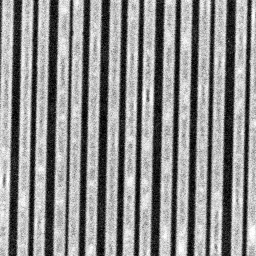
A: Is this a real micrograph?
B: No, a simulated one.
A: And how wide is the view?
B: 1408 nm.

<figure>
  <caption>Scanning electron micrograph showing parallel lines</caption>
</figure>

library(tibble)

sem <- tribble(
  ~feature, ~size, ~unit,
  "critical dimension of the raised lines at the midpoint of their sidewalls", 54.9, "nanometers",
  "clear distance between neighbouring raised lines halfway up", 44.6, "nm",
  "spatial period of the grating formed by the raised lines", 0.0981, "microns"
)